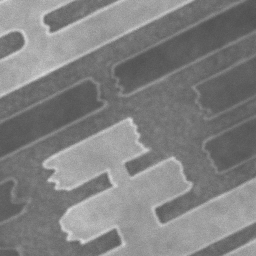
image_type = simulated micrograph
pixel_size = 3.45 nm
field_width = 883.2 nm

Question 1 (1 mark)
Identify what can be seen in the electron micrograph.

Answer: parallel lines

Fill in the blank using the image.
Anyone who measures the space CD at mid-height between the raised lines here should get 0.0719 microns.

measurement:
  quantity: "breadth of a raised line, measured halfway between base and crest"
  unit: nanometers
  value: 119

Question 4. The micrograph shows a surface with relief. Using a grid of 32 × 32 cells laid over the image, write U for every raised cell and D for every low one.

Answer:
UUUUUUUUDDDDDDUUUUUUUUUDDDDDDUUU
UUUUUUDDDDDDUUUUUUUUUDDDDDDUUUUU
UUUUUDDDDDUUUUUUUUUDDDDDDUUUUUUU
UUUUUUDDUUUUUUUUUDDDDDDUUUUUUUUU
DDDUUUUUUUUUUUUDDDDDDUUUUUUUUUUD
DDDUUUUUUUUUUDDDDDDUUUUUUUUUUDDD
DDUUUUUUUUUDDDDDDUUUUUUUUUUDDDDD
UUUUUUUUUDDDDDDUUUUUUUUUUDDDDDDU
UUUUUUUDDDDDDDUUUUUUUUUDDDDDDUUU
UUUUUDDDDDDDDDUUUUUUUDDDDDDUUUUU
UUUDDDDDDUUUDDDUUUUDDDDDDUUUUUUU
UDDDDDDUUUUUDDDUUDDDDDDDDUUUUUUU
DDDDDUUUUUUUUDDDDDDDDDDDDUUUUUUD
DDDUUUUUUUUUUDDDDDDDDDDDDUUUUDDD
DUUUUUUUUUUDDDDDDDDDDDDDDDUDDDDD
UUUUUUUUUDDDDDDUUDDDDDDDDDDDDDUU
UUUUUUUDDDDDDUUUUDDDDDDDDDDDUUUU
UUUUUDDDDDDUUUUUUDDDDDDDDDUUUUUU
UUUDDDDDDUUUUUUUUUDDDDDDDUUUUUUU
UDDDDDDUUUUUUUUUUDDDDDDDDDUUUUUU
DDDDDDUUUUUUUUUUDDDDUUDDDDDUUUDD
DDDDDDDUUUUUUUUUDDUUUUUDDDDUDDDD
DUDDDDUUUUUDDDUUUUUUUUUDDDDDDDDD
UUDDDDDUUDDDDDUUUUUUUUUUDDDDDDUU
UUDDDDDDDDDDUUUUUUUUUUDDDDDDUUUU
UUUDDDDDDDUUUUUUUUUUDDDDDDUUUUUU
UUUDDDDDUUUUUUUUUUUDDDDDUUUUUUUU
UDDDDDDDUUUUUUUUUUUUDDUUUUUUUUUU
DDDDDDDDUUUUUUUUUUUUUUUUUUUUUUDD
DDDDDDDDDUUUDDDUUUUUUUUUUUUUDDDD
DDDDDDDDDDDDDDDUUUUUUUUUUUDDDDDU
UUDDDDDDDDDDDDUUUUUUUUUUDDDDDUUU